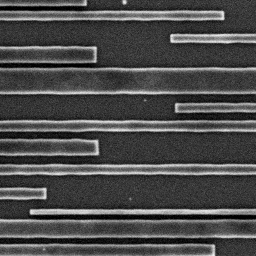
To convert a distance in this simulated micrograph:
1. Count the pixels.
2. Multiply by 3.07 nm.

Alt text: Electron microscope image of groups of lines, slits or small figures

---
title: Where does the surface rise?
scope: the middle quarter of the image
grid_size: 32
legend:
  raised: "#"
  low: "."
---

................................
################################
################################
################################
################################
################################
################################
................................
................................
................................
............................####
............................####
................................
................................
##############.######.#...######
################################
######...#######################
................................
................................
########........................
########........................
########........................
########........................
................................
................................
################################
################################
#.#####.....................####
................................
................................
................................
................................